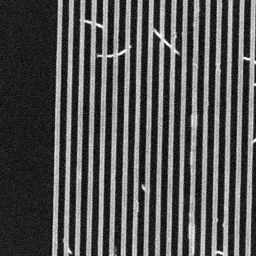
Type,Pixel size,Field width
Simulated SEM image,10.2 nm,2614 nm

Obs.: parallel lines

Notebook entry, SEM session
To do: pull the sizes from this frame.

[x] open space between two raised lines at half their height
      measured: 0.074 µm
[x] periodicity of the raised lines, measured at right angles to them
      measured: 116 nanometres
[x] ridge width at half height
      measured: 37 nm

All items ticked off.